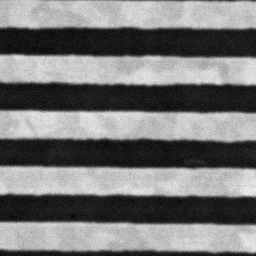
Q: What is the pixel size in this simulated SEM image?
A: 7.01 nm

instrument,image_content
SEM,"lines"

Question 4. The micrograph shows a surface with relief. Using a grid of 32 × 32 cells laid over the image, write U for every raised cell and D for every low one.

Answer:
UUUUUUUUUUUUUUUUUUUUUUUUUUUUUUUU
UUUUUUUUUUUUUUUUUUUUUUUUUUUUUUUU
UUUUUUUUUUUUUUUUUUUUUUUUUUUUUUUU
DDDDUDDDDDDDDDDDDUUUDDDDUUUUUUUD
DDDDDDDDDDDDDDDDDDDDDDDDDDDDDDDD
DDDDDDDDDDDDDDDDDDDDDDDDDDDDDDDD
DDDDDDDDDDDDDDDDDDDDDDDDDDDDDDDD
UUUUUUUUUUUUUUUUUUUUUUUUUUUUUUUU
UUUUUUUUUUUUUUUUUUUUUUUUUUUUUUUU
UUUUUUUUUUUUUUUUUUUUUUUUUUUUUUUU
DDDDDDDDDDDDDDDDDDUUUDDDDDDDDDUU
DDDDDDDDDDDDDDDDDDDDDDDDDDDDDDDD
DDDDDDDDDDDDDDDDDDDDDDDDDDDDDDDD
DDDDDDDDDDDDDDDDDDDDDDDDDDDDDDDD
UUUUUUUUUUUUUUUUUUUUUUUUUUUUUUUU
UUUUUUUUUUUUUUUUUUUUUUUUUUUUUUUU
UUUUUUUUUUUUUUUUUUUUUUUUUUUUUUUU
DDDDDDDDDDDDDDDDDDDDDDDDDDDUUUUD
DDDDDDDDDDDDDDDDDDDDDDDDDDDDDDDD
DDDDDDDDDDDDDDDDDDDDDDDDDDDDDDDD
DDDDDDDDDDDDDDDDDDDDDDDDDDDDDDDD
UUUUUUUUUUUUUUUUUUUUUUUUUUUUUUUU
UUUUUUUUUUUUUUUUUUUUUUUUUUUUUUUU
UUUUUUUUUUUUUUUUUUUUUUUUUUUUUUUU
DDDDDDDDDDDDDDDDDDDDDDDDDDDDUUDD
DDDDDDDDDDDDDDDDDDDDDDDDDDDDDDDD
DDDDDDDDDDDDDDDDDDDDDDDDDDDDDDDD
DDDDDDDDDDDDDDDDDDDDDDDDDDDDDDDD
UUUUUUUUUUUUUUUUUUUUUUUUUUUUUUUU
UUUUUUUUUUUUUUUUUUUUUUUUUUUUUUUU
UUUUUUUUUUUUUUUUUUUUUUUUUUUUUUUU
DDDDDDDDDDDDDDDDDDDDDDDDDDUDDDDU